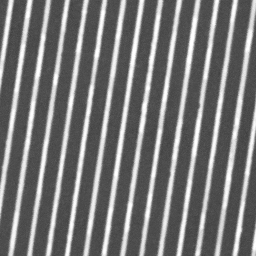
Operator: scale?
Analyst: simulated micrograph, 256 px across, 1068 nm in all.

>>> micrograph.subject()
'parallel lines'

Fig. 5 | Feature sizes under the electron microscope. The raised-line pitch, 77.3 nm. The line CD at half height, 14.9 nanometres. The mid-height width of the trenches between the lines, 14.7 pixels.